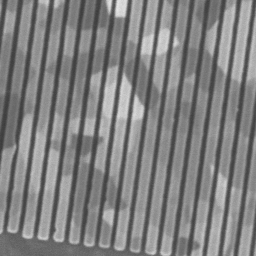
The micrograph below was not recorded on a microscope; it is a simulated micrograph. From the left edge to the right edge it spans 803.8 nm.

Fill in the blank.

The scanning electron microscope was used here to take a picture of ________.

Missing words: parallel lines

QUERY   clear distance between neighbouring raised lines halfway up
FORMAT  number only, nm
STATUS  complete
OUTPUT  19.1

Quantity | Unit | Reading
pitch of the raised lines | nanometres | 48.6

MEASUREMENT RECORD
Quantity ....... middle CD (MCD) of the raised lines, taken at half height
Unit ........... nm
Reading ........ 30